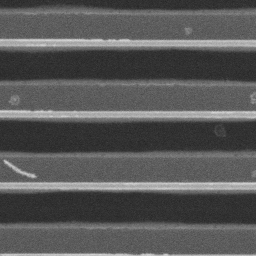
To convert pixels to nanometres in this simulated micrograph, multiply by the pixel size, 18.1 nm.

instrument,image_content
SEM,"lines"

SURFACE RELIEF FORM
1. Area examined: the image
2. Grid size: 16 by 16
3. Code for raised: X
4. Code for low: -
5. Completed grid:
----------------
XXXXXXXXXXXXXXXX
XXXXXXXXXXXXXXXX
----------------
----------------
XXXXXXXXXXXXXXXX
XXXXXXXXXXXXXXXX
----------------
----------------
----------------
XXXXXXXXXXXXXXXX
XXXXXXXXXXXXXXXX
----------------
----------------
XXXXXXXXXXXXXXXX
XXXXXXXXXXXXXXXX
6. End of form